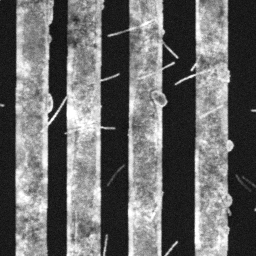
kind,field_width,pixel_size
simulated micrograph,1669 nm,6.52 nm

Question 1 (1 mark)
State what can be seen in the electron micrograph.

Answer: lines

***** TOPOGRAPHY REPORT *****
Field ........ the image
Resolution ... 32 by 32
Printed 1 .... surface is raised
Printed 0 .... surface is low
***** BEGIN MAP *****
00011110011100000111000001110000
00011110011100000111000001110000
00011100011100000111000001110000
00011100011100000111000001110000
00011100011100000111000001110000
00111100011100000111000001110000
00111100011100000111000001110000
00111100011100000111000001110000
00011100011100000111000001110000
00011100011100000111000001110000
00111100011100000111000001110000
00111100011100000111000001110000
00111100011100000111100001110000
00111100011100001111000001110000
00111100011100001111000001110000
00111100011100001111000001110000
00111100011100001111000001110000
00011100011100001111000001110000
00011100011100001111000001111000
00011100011100001111000001110000
00011100011100001111000001110000
00011100011100001111000001110000
00011100011100001111000001110000
00011100011100001111000001110000
00011100011100000111000001110000
00011000011100000111000001111000
00011000011100001111000001110000
00011000011100001111000001110000
00011000011100001111000001110000
00011000011100001111000001110000
00011000011100001111000001110000
00111000011100001111000001110000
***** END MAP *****